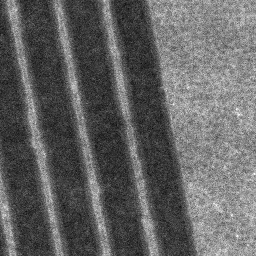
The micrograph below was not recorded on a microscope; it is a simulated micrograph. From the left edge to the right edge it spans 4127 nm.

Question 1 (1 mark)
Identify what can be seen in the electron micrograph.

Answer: parallel lines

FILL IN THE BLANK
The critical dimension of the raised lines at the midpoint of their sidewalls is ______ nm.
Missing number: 178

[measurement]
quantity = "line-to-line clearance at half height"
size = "562 nm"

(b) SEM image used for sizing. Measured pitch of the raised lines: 745 nm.